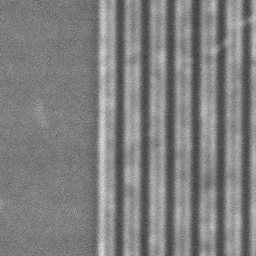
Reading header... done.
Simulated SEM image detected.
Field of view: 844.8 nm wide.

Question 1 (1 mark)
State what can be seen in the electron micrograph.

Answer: parallel lines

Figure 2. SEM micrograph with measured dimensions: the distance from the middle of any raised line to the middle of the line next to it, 83.4 nm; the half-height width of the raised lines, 38.8 nm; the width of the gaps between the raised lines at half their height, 45.4 nm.